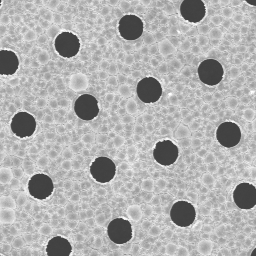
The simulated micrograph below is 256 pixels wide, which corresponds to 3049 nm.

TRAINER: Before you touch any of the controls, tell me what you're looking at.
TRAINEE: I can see a regular array of holes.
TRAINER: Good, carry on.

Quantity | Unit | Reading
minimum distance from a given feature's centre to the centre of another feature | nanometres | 764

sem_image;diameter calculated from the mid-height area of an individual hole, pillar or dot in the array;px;25.9